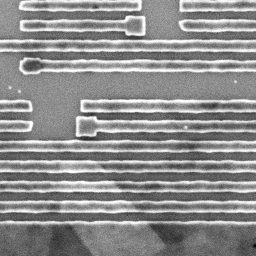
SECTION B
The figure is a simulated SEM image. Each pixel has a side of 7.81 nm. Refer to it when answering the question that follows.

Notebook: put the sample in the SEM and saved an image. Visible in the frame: wiring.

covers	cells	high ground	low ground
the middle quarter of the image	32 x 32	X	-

XXXXXXXXXXXXXXXXXXXXXXXXXXXXXXXX
XXXXXXXXXXXXXXXXXXXXXXXXXXXXXXXX
--------------------------------
--------------------------------
--------------------------------
--------------------------------
--------------------------------
--------------------------------
--------------------------------
----XXXXXXXXXXXXXXXXXXXXXXXXXXXX
----XXXXXXXXXXXXXXXXXXXXXXXXXXXX
----XXXXXXXXXXXXXXXXXXXXXXXXXXXX
--------------------------------
---XXXXX------------------------
---XXXXXXXXXXXXXXXXXXXXXXXXXXXXX
---XXXXXXXXXXXXXXXXXXXXXXXXXXXXX
---XXXXXXXXXXXXXXXXXXXXXXXXXXXXX
---XXXXX------------------------
--------------------------------
XXXXXXXXXXXXXXXXXXXXXXXXXXXXXXXX
XXXXXXXXXXXXXXXXXXXXXXXXXXXXXXXX
XXXXXXXXXXXXXXXXXXXXXXXXXXXXXXXX
--------------------------------
--------------------------------
XXXXXXX----XXXXXXXXX---XXXXXXXXX
XXXXXXXXXXXXXXXXXXXXXXXXXXXXXXXX
XXXXXXXXXXXXXXXXXXXXXXXXXXXXXXXX
--------------------------------
--------------------------------
XX-XXX---XXXXXXXX---XXXXX----XXX
XXXXXXXXXXXXXXXXXXXXXXXXXXXXXXXX
XXXXXXXXXXXXXXXXXXXXXXXXXXXXXXXX